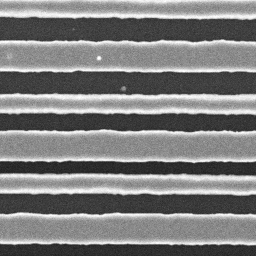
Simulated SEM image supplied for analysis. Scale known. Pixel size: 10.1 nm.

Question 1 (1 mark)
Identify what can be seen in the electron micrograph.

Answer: lines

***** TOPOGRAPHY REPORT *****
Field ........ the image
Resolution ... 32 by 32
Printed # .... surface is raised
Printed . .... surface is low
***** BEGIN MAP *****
################################
################################
................................
................................
................................
################################
################################
################################
################################
................................
................................
................................
################################
################################
................................
................................
#######################.########
################################
################################
################################
................................
................................
################################
################################
................................
................................
................................
################################
################################
################################
..........#..........#####.#.###
................................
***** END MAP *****